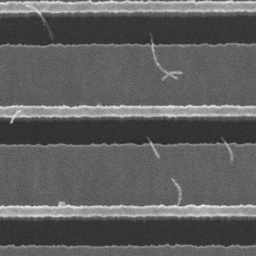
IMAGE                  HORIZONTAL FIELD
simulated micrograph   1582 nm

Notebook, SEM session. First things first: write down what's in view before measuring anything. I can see lines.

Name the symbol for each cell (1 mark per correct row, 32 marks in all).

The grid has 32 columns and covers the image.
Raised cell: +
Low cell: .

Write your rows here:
++++++++++++++++++++++++++++++++
+++++++++++++++++.++.+++.+++++..
................................
................................
................................
...........+....+........+..++++
++++++++++++++++++++++++++++++++
++++++++++++++++++++++++++++++++
++++++++++++++++++++++++++++++++
++++++++++++++++++++++++++++++++
++++++++++++++++++++++++++++++++
++++++++++++++++++++++++++++++++
++++++++++++++++++++++++++++++++
++++++++++++++++++++++++++++++++
++++++++++++++++++++++++++++++++
................................
................................
................................
++++++++++++++++++++++++++++++++
++++++++++++++++++++++++++++++++
++++++++++++++++++++++++++++++++
++++++++++++++++++++++++++++++++
++++++++++++++++++++++++++++++++
++++++++++++++++++++++++++++++++
++++++++++++++++++++++++++++++++
++++++++++++++++++++++++++++++++
++++++++++++++++++++++++++++++++
................................
................................
................................
................................
++++++++++++++++++++++++++++++++